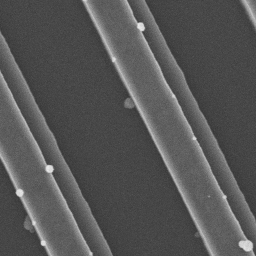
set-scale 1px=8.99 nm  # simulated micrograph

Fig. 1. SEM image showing lines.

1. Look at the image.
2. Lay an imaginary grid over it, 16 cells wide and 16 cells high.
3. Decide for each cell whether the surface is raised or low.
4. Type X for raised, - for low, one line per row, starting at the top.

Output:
-----XXXX------X
------XXXX------
------XXXX------
X------XXXX-----
X-------XXX-----
XX------XXXX----
XX------XXXX----
XXX------XXXX---
XXX------XXXX---
XXXX------XXXX--
XXXX------XXXX--
-XXXX------XXXX-
-XXXX-------XXX-
--XXXX------XXXX
--XXXX-------XXX
---XXXX------XXX